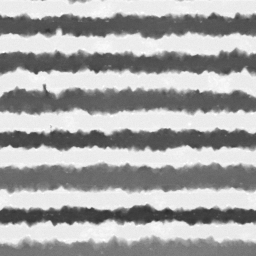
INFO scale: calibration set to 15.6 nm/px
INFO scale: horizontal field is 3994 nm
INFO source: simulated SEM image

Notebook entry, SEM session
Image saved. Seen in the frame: parallel lines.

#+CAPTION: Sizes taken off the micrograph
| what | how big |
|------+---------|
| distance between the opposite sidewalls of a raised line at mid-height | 312 nm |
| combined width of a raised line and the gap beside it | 584 nm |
